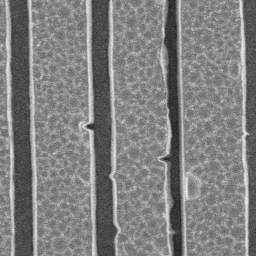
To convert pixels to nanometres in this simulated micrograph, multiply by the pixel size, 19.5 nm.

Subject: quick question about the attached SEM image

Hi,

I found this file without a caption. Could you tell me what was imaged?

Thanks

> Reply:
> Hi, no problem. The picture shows one or a few lines or trenches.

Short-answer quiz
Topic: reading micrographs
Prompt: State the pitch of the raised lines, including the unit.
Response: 1470 nm